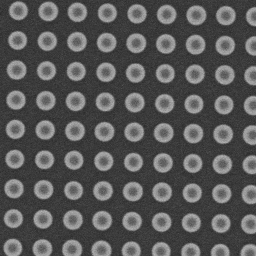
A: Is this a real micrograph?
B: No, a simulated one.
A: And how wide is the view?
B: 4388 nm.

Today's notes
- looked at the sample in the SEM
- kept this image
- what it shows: an array of small figures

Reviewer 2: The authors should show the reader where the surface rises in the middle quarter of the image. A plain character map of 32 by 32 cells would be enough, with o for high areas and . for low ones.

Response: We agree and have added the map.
.oooo....ooo....ooo.....ooo.....
.oooo...ooooo...oooo...oooo....o
.oooo...ooooo...oooo...oooo...oo
.oooo....ooo....oooo...oooo....o
..................o.....oo.....o
................................
................................
.ooo.....oo......oo.............
.oooo...oooo....oooo...oooo....o
.oooo...ooooo..ooooo...oooo...oo
.oooo...oooo...ooooo...oooo...oo
..oo.....oo.....ooo.....ooo....o
................................
................................
..oo............................
.oooo...oooo....ooo....oooo....o
ooooo...oooo...ooooo...oooo...oo
ooooo...oooo...ooooo...oooo...oo
.ooo....oooo....ooo....oooo...oo
........................o......o
................................
................................
.ooo....ooo.....oo......oo......
ooooo...oooo...oooo....oooo...oo
ooooo...oooo...ooooo...oooo...oo
.ooo....oooo...oooo....oooo...oo
.........oo.....ooo....ooo.....o
................................
................................
..o......oo.....................
oooo....oooo...oooo....ooo....oo
ooooo..ooooo...ooooo..ooooo...oo